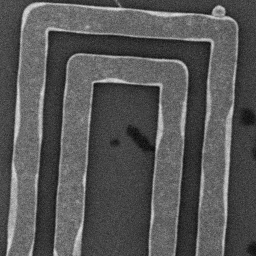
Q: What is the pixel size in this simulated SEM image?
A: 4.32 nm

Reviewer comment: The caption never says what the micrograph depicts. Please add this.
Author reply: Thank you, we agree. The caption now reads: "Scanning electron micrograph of groups of lines, slits or small figures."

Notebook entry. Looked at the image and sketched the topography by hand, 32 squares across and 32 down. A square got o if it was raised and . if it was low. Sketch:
.....oo.........................
...oooooooooooooooo........o....
...oooooooooooooooooooooooooo...
...ooooooooooooooooooooooooooo..
...ooo..........oooooooooooooo..
...ooo....................oooo..
...ooo....................oooo..
...ooo...oooooooooooo.....oooo..
..oooo..ooooooooooooooo...ooo...
..oooo..ooooooooooooooo...ooo...
..oooo..oooo.....oooooo...ooo...
..ooo...oooo........ooo...ooo...
..ooo...ooo.........ooo...ooo...
..ooo...ooo.........ooo...ooo...
..ooo...ooo.........ooo...ooo...
..ooo...ooo.........ooo...ooo...
..ooo...ooo.........ooo...ooo...
..ooo...ooo.........ooo...ooo...
..ooo...ooo.........ooo..ooo....
..ooo...ooo.........ooo..ooo....
..ooo..oooo........oooo..ooo....
..ooo..oooo........oooo..ooo....
..ooo..oooo........oooo..ooo....
..oo...oooo........ooo...ooo....
..oo...oooo........ooo...ooo....
..oo...ooo.........ooo...ooo....
..oo...ooo.........ooo...ooo....
..oo...ooo.........ooo...ooo....
.ooo...ooo.........ooo...ooo....
.ooo...ooo.........ooo...ooo....
.ooo...ooo.........ooo...ooo....
.ooo...ooo.........ooo...ooo....